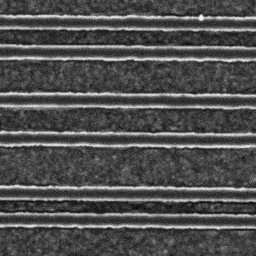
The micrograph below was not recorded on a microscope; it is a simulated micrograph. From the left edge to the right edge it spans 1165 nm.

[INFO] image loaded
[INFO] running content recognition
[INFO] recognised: lines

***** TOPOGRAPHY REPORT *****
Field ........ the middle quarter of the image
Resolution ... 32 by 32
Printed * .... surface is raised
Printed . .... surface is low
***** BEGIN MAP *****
................................
................................
................................
................................
................................
................................
................................
*************...................
********************************
********************************
********************************
................................
................................
................................
................................
................................
................................
**********************.******.**
********************************
********************************
*......**********.**************
................................
................................
................................
................................
................................
................................
................................
................................
................................
................................
********************************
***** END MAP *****